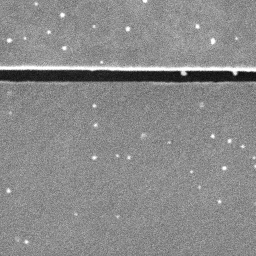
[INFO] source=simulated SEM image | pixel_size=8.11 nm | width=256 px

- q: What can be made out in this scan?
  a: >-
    lines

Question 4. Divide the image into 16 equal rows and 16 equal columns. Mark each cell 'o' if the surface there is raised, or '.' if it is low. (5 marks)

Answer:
oooooooooooooooo
oooooooooooooooo
oooooooooooooooo
oooooooooooooooo
................
................
................
................
................
................
................
................
................
................
................
................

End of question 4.